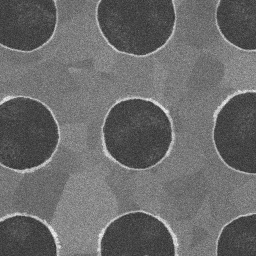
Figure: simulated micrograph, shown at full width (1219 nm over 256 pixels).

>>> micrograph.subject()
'holes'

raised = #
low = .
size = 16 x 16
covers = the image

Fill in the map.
...###.....###..
...###.....###..
...####...####..
################
################
################
...####...####..
...####....##...
....##.....##...
...####...####..
#.######.######.
################
################
########..#####.
...###.....###..
....##.....###..